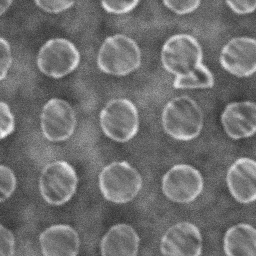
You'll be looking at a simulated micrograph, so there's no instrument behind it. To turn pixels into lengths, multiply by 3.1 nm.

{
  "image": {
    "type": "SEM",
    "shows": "a regular array of raised bodies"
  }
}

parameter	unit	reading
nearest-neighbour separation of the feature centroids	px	61.8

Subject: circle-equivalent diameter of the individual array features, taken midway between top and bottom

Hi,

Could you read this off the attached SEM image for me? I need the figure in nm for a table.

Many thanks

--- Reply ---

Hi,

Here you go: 120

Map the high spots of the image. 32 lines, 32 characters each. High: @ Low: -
@----@@@@----@@@@----@@@@----@@@
----------------------@-------@-
--------------------------------
--------------------------------
--------------------------------
@-----@@@----@@@@----@@@@----@@@
@----@@@@---@@@@@---@@@@@---@@@@
@----@@@@@--@@@@@---@@@@@---@@@@
@----@@@@----@@@@----@@@@---@@@@
----------------------@@@@------
----------------------@@@@------
--------------------------------
--------------@-------@@--------
@-----@@@----@@@@----@@@@---@@@@
@----@@@@----@@@@---@@@@@---@@@@
@----@@@@----@@@@----@@@@---@@@@
@----@@@@----@@@@----@@@@---@@@@
---------------@----------------
--------------------------------
--------------------------------
-------@------@@-------------@@@
@----@@@@----@@@@----@@@@----@@@
@@---@@@@@---@@@@@--@@@@@----@@@
@@---@@@@----@@@@---@@@@@----@@@
@----@@@@----@@@@----@@@-----@@@
--------------------------------
--------------------------------
--------------------------------
------@@@-----@@-----@@@-----@@-
@@---@@@@@---@@@@----@@@@---@@@@
@@---@@@@@---@@@@---@@@@@---@@@@
@@---@@@@@---@@@@---@@@@@---@@@@